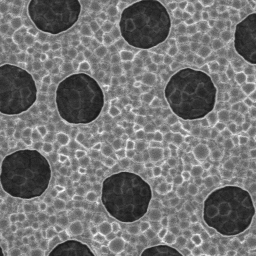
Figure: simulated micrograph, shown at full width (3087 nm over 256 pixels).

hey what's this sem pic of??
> holes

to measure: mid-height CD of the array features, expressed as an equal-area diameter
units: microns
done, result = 0.605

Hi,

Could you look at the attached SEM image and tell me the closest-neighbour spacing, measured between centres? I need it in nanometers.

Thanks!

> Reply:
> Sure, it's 1280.